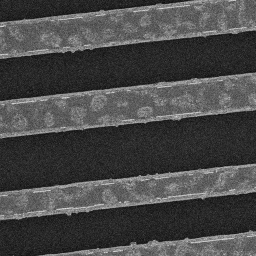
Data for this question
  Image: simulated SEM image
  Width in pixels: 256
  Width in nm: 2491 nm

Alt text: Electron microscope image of one or a few lines or trenches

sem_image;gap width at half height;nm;422